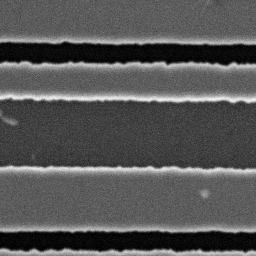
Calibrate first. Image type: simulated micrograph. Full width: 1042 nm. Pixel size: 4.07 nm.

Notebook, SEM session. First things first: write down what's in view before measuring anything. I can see lines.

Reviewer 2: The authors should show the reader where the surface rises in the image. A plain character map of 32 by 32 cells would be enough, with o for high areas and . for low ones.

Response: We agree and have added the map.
oooooooooooooooooooooooooooooooo
oooooooooooooooooooooooooooooooo
oooooooooooooooooooooooooooooooo
oooooooooooooooooooooooooooooooo
oooooooooooooooooooooooooooooooo
................................
................................
................................
oooooooooooooooooooooooooooooooo
oooooooooooooooooooooooooooooooo
oooooooooooooooooooooooooooooooo
oooooooooooooooooooooooooooooooo
..................o..oo......ooo
................................
................................
................................
................................
................................
................................
................................
................................
oooooooooooooooooooooooooooooooo
oooooooooooooooooooooooooooooooo
oooooooooooooooooooooooooooooooo
oooooooooooooooooooooooooooooooo
oooooooooooooooooooooooooooooooo
oooooooooooooooooooooooooooooooo
oooooooooooooooooooooooooooooooo
oooooooooooooooooooooooooooooooo
................................
................................
oooooooooooooooooooooo.oo.oooo.o